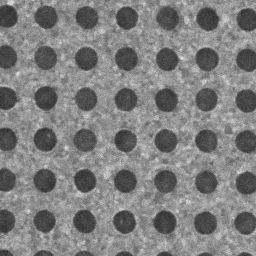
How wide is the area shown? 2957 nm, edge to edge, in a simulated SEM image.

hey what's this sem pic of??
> a regular array of holes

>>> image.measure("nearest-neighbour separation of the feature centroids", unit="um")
0.462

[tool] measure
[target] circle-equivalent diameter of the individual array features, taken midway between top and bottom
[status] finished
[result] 281 nm